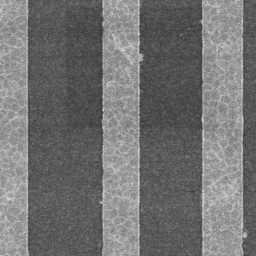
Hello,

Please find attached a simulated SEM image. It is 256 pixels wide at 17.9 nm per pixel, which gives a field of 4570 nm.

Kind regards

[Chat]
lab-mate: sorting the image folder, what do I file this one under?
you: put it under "one or a few lines or trenches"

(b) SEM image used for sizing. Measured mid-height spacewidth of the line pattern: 1240 nm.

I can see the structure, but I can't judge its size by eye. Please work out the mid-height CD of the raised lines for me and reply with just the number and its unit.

669 nm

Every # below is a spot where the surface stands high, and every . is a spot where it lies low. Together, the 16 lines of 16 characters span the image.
##....###....##.
##....###....##.
##....###....##.
##....###....##.
##....###....##.
##....###....##.
##....###....##.
##....###....##.
##....###....##.
##....###....##.
##....###....##.
##....###....##.
##....###....##.
##....###....##.
##....###....##.
##....###....##.